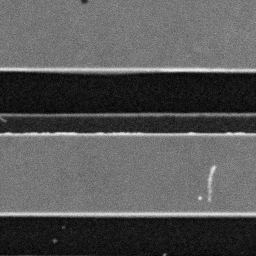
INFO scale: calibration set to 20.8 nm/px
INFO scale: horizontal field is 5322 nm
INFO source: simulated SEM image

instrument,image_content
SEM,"lines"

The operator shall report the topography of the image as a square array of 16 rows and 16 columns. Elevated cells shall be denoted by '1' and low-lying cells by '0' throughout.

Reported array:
1111111111111111
1111111111111111
1111111111111111
1111111111111111
0000000000000000
0000000000000000
0000000000000000
0000000000000000
1111111111111111
1111111111111111
1111111111111111
1111111111111111
1111111111111111
0000000000000000
0000000000000000
0000000000000000